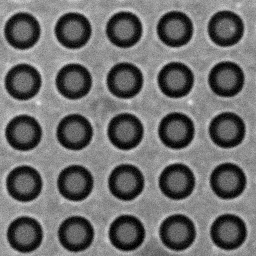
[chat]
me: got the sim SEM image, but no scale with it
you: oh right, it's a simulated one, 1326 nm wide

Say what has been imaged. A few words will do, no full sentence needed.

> an array of small figures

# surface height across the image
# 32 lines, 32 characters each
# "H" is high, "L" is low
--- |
HHHHHHHHHHHHHHHHHHHHHHHHHHHHHHHH
HHLHHHHHHHHHHHHLHHHHHLLHHHHLLHHH
HLLLLHHLLLLHHHLLLLHHLLLLHHLLLLHH
LLLLLHHLLLLHHLLLLLHHLLLLHHLLLLLH
LLLLLHHLLLLHHLLLLLHHLLLLHHLLLLHH
HLLLLHHLLLLHHHLLLHHHLLLHHHHLLLHH
HHHHHHHHHHHHHHHHHHHHHHHHHHHHHHHH
HHHHHHHHHHHHHHHHHHHHHHHHHHHHHHHH
HLLLLHHHLLLHHHLLLHHHLLLLHHLLLLHH
HLLLLHHLLLLHHLLLLLHHLLLLHHLLLLLH
HLLLLHHLLLLHHLLLLLHHLLLLHHLLLLLH
HLLLLHHLLLLHHHLLLHHHLLLLHHHLLLHH
HHLLHHHHHHHHHHHHHHHHHHHHHHHHHHHH
HHHHHHHHHHHHHHHHHHHHHHHHHHHHHHHH
HHLLHHHHLLHHHHLLLHHHHLLLHHHLLLHH
HLLLLHHLLLLHHLLLLLHHLLLLHHLLLLLH
HLLLLHHLLLLLHLLLLLHHLLLLHHLLLLLH
HLLLLHHLLLLHHHLLLLHHLLLLHHLLLLHH
HHLLHHHHLLLHHHLLLHHHHLLHHHHHLHHH
HHHHHHHHHHHHHHHHHHHHHHHHHHHHHHHH
HHHHHHHHHHHHHHHLHHHHHLLHHHHHLHHH
HLLLLHHHLLLHHHLLLLHHLLLLHHLLLLLH
HLLLLHHLLLLLHLLLLLHHLLLLHHLLLLLH
HLLLLHHLLLLLHHLLLLHHLLLLHHLLLLLH
HLLLLHHHLLLHHHLLLHHHHLLLHHHLLLHH
HHHHHHHHHHHHHHHHHHHHHHHHHHHHHHHH
HHHHHHHHHHHHHHHHHHHHHHHHHHHHHHHH
HHLLLHHHLLLHHHLLLLHHLLLLHHHLLLHH
HLLLLHHLLLLLHHLLLLHHLLLLHHLLLLLH
HLLLLHHLLLLLHHLLLLHHLLLLLHLLLLLH
HLLLLHHHLLLHHHLLLLHHLLLLHHHLLLHH
HHLLHHHHHLHHHHHHHHHHHHHHHHHHHHHH